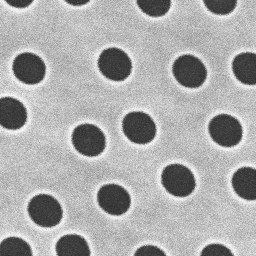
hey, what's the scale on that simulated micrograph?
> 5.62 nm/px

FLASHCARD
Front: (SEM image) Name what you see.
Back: a regular array of holes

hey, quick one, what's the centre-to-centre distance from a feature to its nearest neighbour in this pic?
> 381 nm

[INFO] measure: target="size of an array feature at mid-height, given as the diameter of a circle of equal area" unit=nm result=195